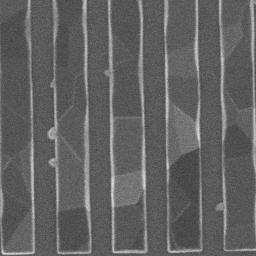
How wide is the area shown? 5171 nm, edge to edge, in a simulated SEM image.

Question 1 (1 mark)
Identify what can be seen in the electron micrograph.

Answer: wiring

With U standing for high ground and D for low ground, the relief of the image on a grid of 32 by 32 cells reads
UUUUDDDUUUUDDDUUUDDDDUUUUDDDUUUD
UUUUDDDUUUUDDDUUUUDDDUUUUDDDUUUU
UUUDDDDUUUUDDDUUUUDDDUUUUDDDUUUU
UUUDDDDUUUUDDDUUUUDDDUUUUDDDUUUU
UUUUDDDUUUUDDDUUUUDDDUUUUDDDUUUU
UUUUDDDUUUUDDDUUUUDDDUUUDDDDUUUU
UUUUDDDUUUUDDDUUUUDDDUUUDDDDUUUU
UUUUDDDUUUUDDDUUUUDDDUUUUDDDUUUU
UUUUDDDUUUUDDDUUUDDDDUUUUDDDUUUU
UUUUDDDUUUUDDDUUUUDDDUUUUDDDUUUU
UUUUDDDUUUUDDDUUUUDDDUUUUDDDUUUU
UUUUDDDUUUUDDDUUUUDDDUUUUDDDUUUU
UUUUDDDUUUUDDDUUUUDDDUUUUDDDUUUU
UUUUDDDUUUUDDDUUUUDDDUUUUDDDUUUU
UUUUDDDUUUUDDDUUUUDDDUUUUDDDUUUU
UUUUDDDUUUUDDDUUUUDDDUUUUDDDUUUU
UUUUDDUUUUUDDDUUUUDDDUUUUDDDUUUU
UUUUDDDUUUUDDDUUUUDDDUUUUDDDUUUU
UUUUDDDUUUUDDDUUUUDDDUUUUDDDUUUU
UUUUDDDUUUUDDDUUUUDDDUUUUDDDUUUU
UUUUDDDUUUUDDDUUUUDDDUUUUDDDUUUU
UUUUDDDUUUUDDDUUUUDDDUUUUDDDUUUU
UUUUDDDUUUUDDDUUUUDDDUUUUDDDUUUU
UUUUDDDUUUUDDDUUUUDDDUUUUDDDUUUU
UUUUDDDUUUUDDDUUUUDDDUUUUDDDUUUU
UUUUDDDUUUUDDDUUUUDDDUUUUDDDUUUU
UUUUDDDUUUUDDDUUUUDDDUUUUDDDUUUU
UUUUDDDUUUUDDDUUUUDDDUUUUDDDUUUU
UUUUDDDUUUUDDDUUUUDDDUUUUDDDUUUU
UUUUDDDUUUUDDDUUUUDDDUUUUDDDUUUU
UUUUDDDUUUUDDDUUUUDDDUUUUDDDUUUU
UUUUDDDUUUUDDDDDDDDDDDDDDDDDDDDD